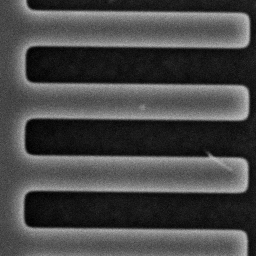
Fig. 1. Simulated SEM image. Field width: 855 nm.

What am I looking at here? groups of lines, slits or small figures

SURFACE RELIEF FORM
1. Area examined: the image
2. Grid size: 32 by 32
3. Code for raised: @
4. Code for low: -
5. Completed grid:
@@@-----------------------------
@@@@@@@@@@@@@@@-----------------
@@@@@@@@@@@@@@@@@@@@@@@@@@@@@@@-
@@@@@@@@@@@@@@@@@@@@@@@@@@@@@@@-
@@@@@@@@@@@@@@@@@@@@@@@@@@@@@@@-
@@@@@@@@@@@@@@@@@@@@@@@@@@@@@@@-
@@@-----------------------------
@@@-----------------------------
@@@-----------------------------
@@@-----------------------------
@@@@@@@@@@@@@@@-----------------
@@@@@@@@@@@@@@@@@@@@@@@@@@@@@@@-
@@@@@@@@@@@@@@@@@@@@@@@@@@@@@@@-
@@@@@@@@@@@@@@@@@@@@@@@@@@@@@@@-
@@@@@@@@@@@@@@@@@@@@@@@@@@@@@@@-
@@@-----------------------------
@@@-----------------------------
@@@-----------------------------
@@@-----------------------------
@@@@@---------------------------
@@@@@@@@@@@@@@@@@@@@@@@@@@@@@@@-
@@@@@@@@@@@@@@@@@@@@@@@@@@@@@@@-
@@@@@@@@@@@@@@@@@@@@@@@@@@@@@@@-
@@@@@@@@@@@@@@@@@@@@@@@@@@@@@@@-
@@@-----------------------------
@@@-----------------------------
@@@-----------------------------
@@@-----------------------------
@@@@@---------------------------
@@@@@@@@@@@@@@@@@@@@@@@@@@@@@@@-
@@@@@@@@@@@@@@@@@@@@@@@@@@@@@@@-
@@@@@@@@@@@@@@@@@@@@@@@@@@@@@@@-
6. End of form